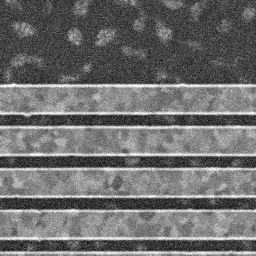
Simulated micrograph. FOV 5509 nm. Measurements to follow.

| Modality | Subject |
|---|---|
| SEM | parallel lines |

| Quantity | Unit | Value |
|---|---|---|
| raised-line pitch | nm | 897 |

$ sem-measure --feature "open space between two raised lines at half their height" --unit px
14.1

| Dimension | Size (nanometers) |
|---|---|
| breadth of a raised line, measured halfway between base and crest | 589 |